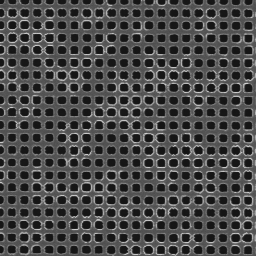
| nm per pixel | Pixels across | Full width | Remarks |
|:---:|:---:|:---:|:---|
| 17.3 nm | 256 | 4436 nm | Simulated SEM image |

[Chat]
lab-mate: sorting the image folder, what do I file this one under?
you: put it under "a regular array of holes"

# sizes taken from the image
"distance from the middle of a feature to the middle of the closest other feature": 0.21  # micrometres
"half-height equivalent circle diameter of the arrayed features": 152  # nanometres